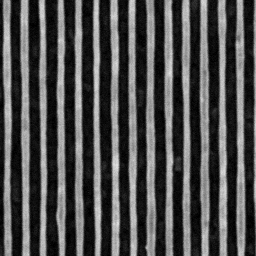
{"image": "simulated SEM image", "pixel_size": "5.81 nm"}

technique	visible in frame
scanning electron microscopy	parallel lines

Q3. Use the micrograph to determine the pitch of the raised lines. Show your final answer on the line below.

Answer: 0.104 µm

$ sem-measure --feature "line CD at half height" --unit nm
37.8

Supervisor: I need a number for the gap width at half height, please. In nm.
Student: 64.6